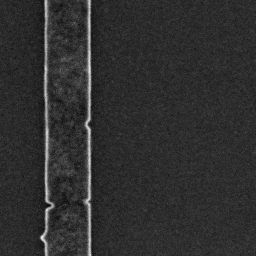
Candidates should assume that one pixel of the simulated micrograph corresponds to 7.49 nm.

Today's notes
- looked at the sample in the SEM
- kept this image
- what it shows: one or a few lines or trenches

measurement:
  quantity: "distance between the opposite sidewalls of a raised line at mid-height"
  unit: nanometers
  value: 331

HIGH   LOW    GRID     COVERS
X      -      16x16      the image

---XXX----------
---XXX----------
---XXX----------
---XXX----------
---XXX----------
---XXX----------
---XXX----------
---XXX----------
---XXX----------
---XXX----------
---XXX----------
---XXX----------
---XXX----------
---XXX----------
---XXX----------
---XXX----------